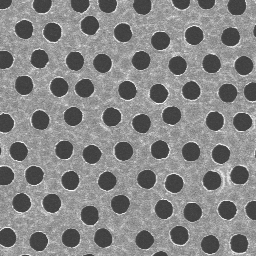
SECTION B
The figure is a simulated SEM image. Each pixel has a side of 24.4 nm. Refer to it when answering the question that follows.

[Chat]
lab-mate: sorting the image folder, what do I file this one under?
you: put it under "a regular array of holes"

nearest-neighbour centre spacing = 28.6 pixels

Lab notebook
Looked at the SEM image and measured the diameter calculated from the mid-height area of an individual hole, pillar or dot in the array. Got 463 nm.